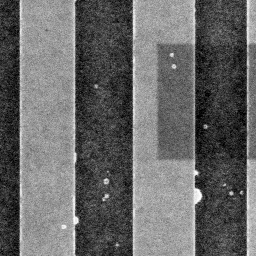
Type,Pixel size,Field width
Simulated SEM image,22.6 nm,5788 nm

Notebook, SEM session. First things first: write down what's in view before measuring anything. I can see lines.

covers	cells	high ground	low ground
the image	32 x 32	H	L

LLLHHHHHHLLLLLLLLHHHHHHHLLLLLLLH
LLLHHHHHHLLLLLLLLHHHHHHHLLLLLLLH
LLLHHHHHHLLLLLLLLHHHHHHHLLLLLLLH
LLLHHHHHHLLLLLLLLHHHHHHHLLLLLLLH
LLLHHHHHHLLLLLLLLHHHHHHHLLLLLLLH
LLLHHHHHHLLLLLLLLHHHHHHHLLLLLLLH
LLLHHHHHHLLLLLLLLHHHHHHHLLLLLLLH
LLLHHHHHHLLLLLLLLHHHHHHHLLLLLLLH
LLLHHHHHHLLLLLLLLHHHHHHHLLLLLLLH
LLLHHHHHHLLLLLLLLHHHHHHHLLLLLLLH
LLLHHHHHHLLLLLLLLHHHHHHHLLLLLLLH
LLLHHHHHHLLLLLLLLHHHHHHHLLLLLLLH
LLLHHHHHHLLLLLLLLHHHHHHHLLLLLLLH
LLLHHHHHHLLLLLLLLHHHHHHHLLLLLLLH
LLLHHHHHHLLLLLLLLHHHHHHHLLLLLLLH
LLLHHHHHHLLLLLLLLHHHHHHHLLLLLLLH
LLLHHHHHHLLLLLLLLHHHHHHHLLLLLLLH
LLLHHHHHHLLLLLLLLHHHHHHHLLLLLLLH
LLLHHHHHHLLLLLLLLHHHHHHHLLLLLLLH
LLLHHHHHHLLLLLLLLHHHHHHHLLLLLLLH
LLLHHHHHHLLLLLLLLHHHHHHHLLLLLLLH
LLLHHHHHHLLLLLLLLHHHHHHHLLLLLLLH
LLLHHHHHHLLLLLLLLHHHHHHHLLLLLLLH
LLLHHHHHHLLLLLLLLHHHHHHHLLLLLLLH
LLLHHHHHHLLLLLLLLHHHHHHHLLLLLLLH
LLLHHHHHHLLLLLLLLHHHHHHHLLLLLLLH
LLLHHHHHHLLLLLLLLHHHHHHHLLLLLLLH
LLLHHHHHHLLLLLLLLHHHHHHHLLLLLLLH
LLLHHHHHHLLLLLLLLHHHHHHHLLLLLLLH
LLLHHHHHHLLLLLLLLHHHHHHHLLLLLLLH
LLLHHHHHHLLLLLLLLHHHHHHHLLLLLLLH
LLLHHHHHHLLLLLLLLHHHHHHHLLLLLLLH